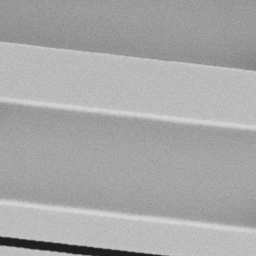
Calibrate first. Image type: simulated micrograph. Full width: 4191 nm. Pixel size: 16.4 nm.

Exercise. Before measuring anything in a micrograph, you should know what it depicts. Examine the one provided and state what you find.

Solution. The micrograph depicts lines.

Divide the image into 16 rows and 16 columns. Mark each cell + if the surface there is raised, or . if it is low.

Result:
................
................
................
+++++++.........
++++++++++++++++
++++++++++++++++
....++++++++++++
............++++
................
................
................
................
................
+++++++.........
++++++++++++++++
+.....++++++++++